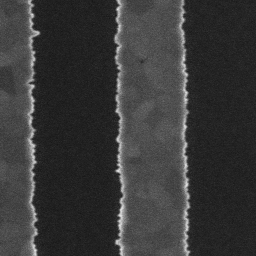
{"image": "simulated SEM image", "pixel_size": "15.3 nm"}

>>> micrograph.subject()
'one or a few lines or trenches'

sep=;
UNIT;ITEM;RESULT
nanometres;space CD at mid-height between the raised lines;1320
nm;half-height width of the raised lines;1020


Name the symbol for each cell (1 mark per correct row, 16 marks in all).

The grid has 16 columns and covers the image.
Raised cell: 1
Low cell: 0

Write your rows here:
1100000111100000
1100000111100000
1100000111100000
1100000111110000
1100000111110000
1100000111110000
1100000111110000
1100000111110000
1100000111110000
1100000111110000
1100000111110000
1100000011110000
1100000011110000
1100000011110000
1100000111110000
1100000011110000